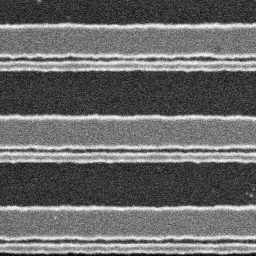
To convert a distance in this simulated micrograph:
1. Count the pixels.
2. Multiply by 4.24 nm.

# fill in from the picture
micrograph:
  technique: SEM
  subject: lines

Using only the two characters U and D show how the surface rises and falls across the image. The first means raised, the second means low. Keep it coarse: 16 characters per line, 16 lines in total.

DDDDDDDDDDDDDDDD
DDDDDDDDDDDDDDDD
UUUUUUUUUUUUUUUU
UUUUUUUUUUUUUUUU
DDDDDDDDDDDDDDDD
DDDDDDDDDDDDDDDD
DDDDDDDDDDDDDDDD
UUUUUUUUUUUUUUUU
UUUUUUUUUUUUUUUU
UUUUUUUUUUUUUUUU
DDDDDDDDDDDDDDDD
DDDDDDDDDDDDDDDD
DDDDDDDDDDDDDDDD
UUUUUUUUUUUUUUUU
UUUUUUUUUUUUUUUU
UUUUUUUUUUUUUUUU